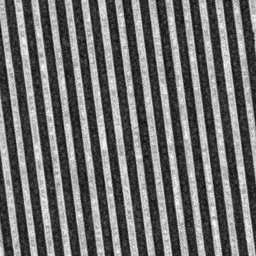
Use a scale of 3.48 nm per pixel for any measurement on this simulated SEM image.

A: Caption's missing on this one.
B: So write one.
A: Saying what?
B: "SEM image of parallel lines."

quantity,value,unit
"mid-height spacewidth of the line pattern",0.0366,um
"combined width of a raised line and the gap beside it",57.8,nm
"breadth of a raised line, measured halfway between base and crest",0.0198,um